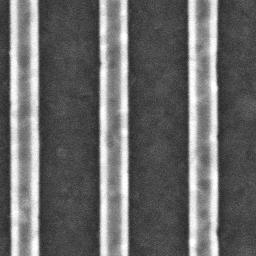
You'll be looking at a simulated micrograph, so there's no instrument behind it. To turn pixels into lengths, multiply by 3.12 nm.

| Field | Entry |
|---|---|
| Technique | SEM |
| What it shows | one or a few lines or trenches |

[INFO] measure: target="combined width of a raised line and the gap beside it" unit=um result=0.279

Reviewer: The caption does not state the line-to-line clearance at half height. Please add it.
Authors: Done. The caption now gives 0.209 um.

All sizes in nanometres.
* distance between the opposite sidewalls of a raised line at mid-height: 68.7